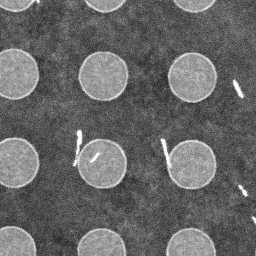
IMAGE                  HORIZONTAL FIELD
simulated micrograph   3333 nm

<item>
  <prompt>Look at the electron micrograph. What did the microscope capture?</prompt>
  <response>raised bodies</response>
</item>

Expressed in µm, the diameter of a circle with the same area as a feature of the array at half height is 0.626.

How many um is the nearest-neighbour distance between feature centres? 1.14